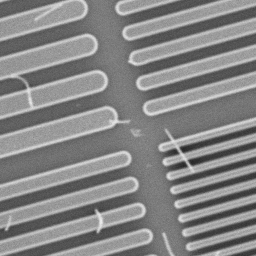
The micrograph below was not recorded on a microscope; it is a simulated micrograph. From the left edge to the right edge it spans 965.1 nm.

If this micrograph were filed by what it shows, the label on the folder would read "groups of lines, slits or small figures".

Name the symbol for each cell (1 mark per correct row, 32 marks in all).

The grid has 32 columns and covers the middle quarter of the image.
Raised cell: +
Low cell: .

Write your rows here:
..............................++
.........................+++++++
.....+++++............++++++++++
..++++++++.........++++++++++++.
+++++++++++.......+++++++++.....
++++++++++.........++++.........
+++++++++.......................
++++++.......................+++
++......................++++++++
.....................+++++++++++
....................++++++++++..
........++++........++++++......
....+++++++++...................
.++++++++++++...................
+++++++++++++...................
++++++++++++....................
+++++++++.......................
+++++...........................
++.............................+
..........................++++++
........................+++++...
........................++......
.............+++.............+++
.........++++++++.........++++++
.....+++++++++++.........+++....
..+++++++++++++................+
++++++++++++.................+++
+++++++...................+++++.
++++......................++....
+............+++++..............
.........+++++++++...........+++
.....+++++++++++++.........++++.